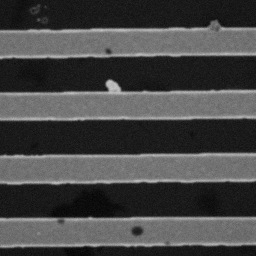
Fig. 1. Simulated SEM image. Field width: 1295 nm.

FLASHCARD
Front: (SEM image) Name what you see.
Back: lines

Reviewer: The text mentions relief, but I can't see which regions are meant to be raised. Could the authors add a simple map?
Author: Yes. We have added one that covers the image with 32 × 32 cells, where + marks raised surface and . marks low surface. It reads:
................................
................................
................................
..........................++....
++++++++++++++++++++++++++++++++
++++++++++++++++++++++++++++++++
++++++++++++++++++++++++++++++++
................................
................................
................................
................................
.............++......+++++++++++
++++++++++++++++++++++++++++++++
++++++++++++++++++++++++++++++++
++++++++++++++++++++++++++++++++
................................
................................
................................
................................
..+..+++++++++++++++++++++++++++
++++++++++++++++++++++++++++++++
++++++++++++++++++++++++++++++++
++++++++++++++++++++++++++++++++
................................
................................
................................
................................
++++++++++++++++++++++++++++++++
++++++++++++++++++++++++++++++++
++++++++++++++++++++++++++++++++
++++++++++++++++++++++++++++++++
................................